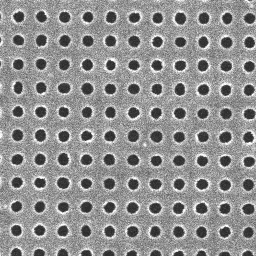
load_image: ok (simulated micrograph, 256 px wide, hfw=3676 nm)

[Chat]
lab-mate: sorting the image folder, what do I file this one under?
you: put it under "a regular array of holes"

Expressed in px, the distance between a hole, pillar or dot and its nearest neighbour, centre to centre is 22.8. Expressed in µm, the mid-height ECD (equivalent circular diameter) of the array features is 0.162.